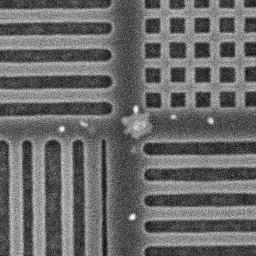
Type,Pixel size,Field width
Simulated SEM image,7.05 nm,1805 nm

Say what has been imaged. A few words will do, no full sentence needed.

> groups of lines, slits or small figures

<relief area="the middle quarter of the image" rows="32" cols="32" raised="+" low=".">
+++++++++++++++++++++++++++...++
++++++++++++++++++++....++.....+
++........++++++++++....++.....+
............++++++++....++.....+
............++++++++....+++....+
............++++++++++++++++++++
........++++++++++++++++++++++++
++++++++++++++++++++....+++....+
++++++++++++++++++++....++.....+
...........+++++++++.....+.....+
............++++++++.....+.....+
............++++++++++++++++++++
............++++++++++++++++++++
++++++++++++++++++++++++++++++++
++++++++++++++++++++++++++++++++
++++++++++++++++++++++++++++++++
++++++++++++++++++++++++++++++++
++++++++++++++++++++++++++++++++
++++++++++++++++++++++++++++++++
++...++++..++++++++++...........
++...++++..+++++++++............
++...++++..+++++++++............
++...++++..+++++++++............
++...++++..+++++++++++++++++++++
++...++++..+++++++++++++++++++++
++...++++..+++++++++++++++++++++
++...++++..+++++++++............
++...++++..+++++++++............
++...++++..+++++++++............
++...++++..+++++++++++++++++++..
++...++++..+++++++++++++++++++++
++...++++..+++++++++++++++++++++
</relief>